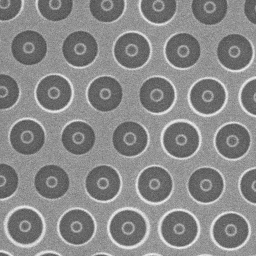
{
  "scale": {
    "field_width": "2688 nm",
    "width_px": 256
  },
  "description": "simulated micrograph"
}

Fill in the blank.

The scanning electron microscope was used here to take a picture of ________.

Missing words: an array of small figures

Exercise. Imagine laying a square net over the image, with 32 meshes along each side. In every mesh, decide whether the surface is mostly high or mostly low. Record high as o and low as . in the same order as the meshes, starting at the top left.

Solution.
...oo....oo.....o.....oo....ooo.
..ooo....oo....ooo....oo....ooo.
.ooooo..oooo..oooo...oooo...ooo.
oooooooooooooooooooooooooooooooo
oo...ooo....ooo...oooo..oooo..oo
o.....oo....oo.....oo....oo....o
o.....oo....oo.....oo....oo.....
oo...ooo....ooo...ooo....oo....o
oooooooooooooooo.ooooo.ooooo...o
.ooooo..oooooooooooooooooooooooo
..ooo....oo....ooo...ooo....ooo.
..oo.....oo....oo.....oo....oo..
..ooo....oo....oo.....oo....oo..
.oooo...oooo...ooo...ooo....oo..
oooooooooooooooooooooooooooooooo
oo...oooo..oooo..oooo...oooo..oo
o.....oo....oo....oo.....oo....o
o.....oo....oo.....o.....oo....o
oo...ooo....oo....ooo....oo....o
oooooooooooooooo.ooooo..oooo..oo
.ooooooooooooooooooooooooooooooo
..ooo...ooo....ooo...ooo...oooo.
..oo.....oo....oo.....oo....oo..
..oo.....oo....oo.....oo....oo..
.oooo...ooo....ooo...ooo....oo..
oooooooooooooooooooooooooooooooo
oo...ooo...oooo..oooo..ooooooooo
o....ooo....oo....oo....ooo....o
o.....o.....oo.....o.....o.....o
o....ooo....oo....oo.....oo....o
oo..ooooo.ooooo..oooo...ooo...oo
.ooooooooooooooooooooooooooooooo